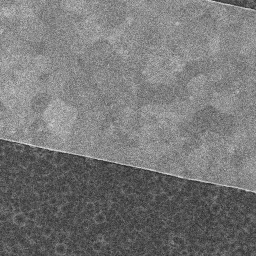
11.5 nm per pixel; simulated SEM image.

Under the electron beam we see one or a few lines or trenches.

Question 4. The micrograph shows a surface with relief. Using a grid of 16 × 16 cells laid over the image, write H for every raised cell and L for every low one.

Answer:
HHHHHHHHHHHHHHHL
HHHHHHHHHHHHHHHH
HHHHHHHHHHHHHHHH
HHHHHHHHHHHHHHHH
HHHHHHHHHHHHHHHH
HHHHHHHHHHHHHHHH
HHHHHHHHHHHHHHHH
HHHHHHHHHHHHHHHH
HHHHHHHHHHHHHHHH
LLLHHHHHHHHHHHHH
LLLLLLLLLHHHHHHH
LLLLLLLLLLLLLHHH
LLLLLLLLLLLLLLLL
LHLLLLLLLLLLLLLL
LLLLLLLLLLLLLLLL
LLLLLLLLLLLLLLLL